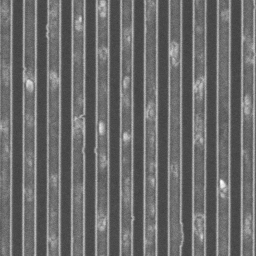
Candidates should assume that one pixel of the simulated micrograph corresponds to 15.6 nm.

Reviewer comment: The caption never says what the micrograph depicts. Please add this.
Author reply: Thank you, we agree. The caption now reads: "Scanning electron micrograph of parallel lines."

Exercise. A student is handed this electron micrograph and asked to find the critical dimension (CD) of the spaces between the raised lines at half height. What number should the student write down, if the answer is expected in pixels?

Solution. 11.9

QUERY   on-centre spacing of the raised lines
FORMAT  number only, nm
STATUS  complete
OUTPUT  379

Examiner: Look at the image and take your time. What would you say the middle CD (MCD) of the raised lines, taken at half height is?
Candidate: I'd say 199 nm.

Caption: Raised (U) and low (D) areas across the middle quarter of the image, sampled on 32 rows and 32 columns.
UUDDDUUUDDDUUUDDDUUUDDDUUUDDDUUU
UUDDDUUUDDDUUUDDDUUUDDDUUUDDDUUU
UUDDDUUUDDDUUUDDDUUUDDDUUUDDDUUU
UUDDDUUUDDDUUUDDDUUUDDDUUUDDDUUU
UUDDDUUUDDDUUUDDDUUUDDDUUUDDDUUU
UUDDDUUUDDDUUUDDDUUUDDDUUUDDDUUU
UUDDDUUUDDDUUUDDDUUUDDDUUUDDDUUU
UUDDDUUUDDDUUUDDDUUUDDDUUUDDDUUU
UUDDDUUUDDDUUUDDDUUUDDDUUUDDDUUU
UUDDDUUUDDDUUUDDDUUUDDDUUUDDDUUU
UUDDDUUUDDDUUUDDDUUUDDDUUUDDDUUU
UUDDDUUUDDDUUUDDDUUUDDDUUUDDDUUU
UUDDDUUUDDDUUUDDDUUUDDDUUUDDDUUU
UUDDDUUUDDDUUUDDDUUUDDDUUUDDDUUU
UUDDDUUUDDDUUUDDDUUUDDDUUUDDDUUU
UUDDDUUUDUDUUUDDDUUUDDDUUUDDDUUU
UUDDDUUUDUDUUUDDDUUUDDDUUUDDDUUU
UUDDDUUUDDDUUUDDDUUUDDDUUUDDDUUU
UUDDDUUUDDDUUUDDDUUUDDDUUUDDDUUU
UUDDDUUUDDDUUUDDDUUUDDDUUUDDDUUU
UUDDDUUUDDDUUUDDDUUUDDDUUUDDDUUU
UUDDDUUUDDDUUUDDDUUUDDDUUUDDDUUU
UUDDDUUUDDDUUUDDDUUUDDDUUUDDDUUU
UUDDDUUUDDDUUUDDDUUUDDDUUUDDDUUU
UUDDDUUUDDDUUUDDDUUUDDDUUUDDDUUU
UUDDDUUUDDDUUUDDDUUUDDDUUUDDDUUU
UUDDDUUUDDDUUUDDDUUUDDDUUUDDDUUU
UUDDDUUUDDDUUUDDDUUUDDDUUUDDDUUU
UUDDDUUUDDDUUUDDDUUUDDDUUUDDDUUU
UUDDDUUUDDDUUUDDDUUUDDDUUUDDDUUU
UUDDDUUUDDDUUUDDDUUUDDDUUUDDDUUU
UUDDDUUUDDDUUUDDDUUUDDDUUUDDDUUU